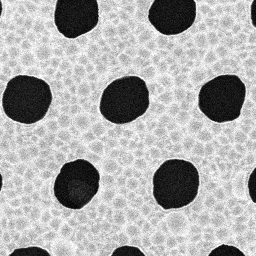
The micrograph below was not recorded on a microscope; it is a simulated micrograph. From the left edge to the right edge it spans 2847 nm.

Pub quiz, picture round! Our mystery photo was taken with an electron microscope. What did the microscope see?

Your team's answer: holes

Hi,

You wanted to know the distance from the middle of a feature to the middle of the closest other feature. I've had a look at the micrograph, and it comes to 1090 nm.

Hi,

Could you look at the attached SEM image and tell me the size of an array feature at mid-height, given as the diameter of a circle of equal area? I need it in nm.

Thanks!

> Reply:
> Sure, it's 538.